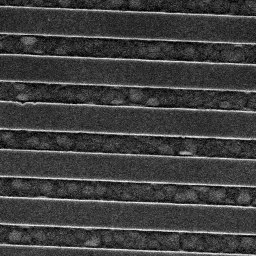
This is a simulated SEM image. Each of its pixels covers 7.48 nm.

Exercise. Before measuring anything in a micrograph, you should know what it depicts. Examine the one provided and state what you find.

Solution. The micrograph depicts parallel lines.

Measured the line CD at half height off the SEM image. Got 204 nm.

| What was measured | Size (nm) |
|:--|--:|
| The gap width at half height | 153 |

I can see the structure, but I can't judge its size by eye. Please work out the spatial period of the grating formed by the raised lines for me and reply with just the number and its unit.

357 nm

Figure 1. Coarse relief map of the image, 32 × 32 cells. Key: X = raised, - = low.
--------------------------------
XXXXXXXXXXXXXXXXX---------------
XXXXXXXXXXXXXXXXXXXXXXXXXXXXXXXX
XXXXXXXXXXXXXXXXXXXXXXXXXXXXXXXX
---------XXXXXXXXXXXXXXXXXXXXXXX
--------------------------------
--------------------------------
XXXXXXXXXXXXXXXXXX--------------
XXXXXXXXXXXXXXXXXXXXXXXXXXXXXXXX
XXXXXXXXXXXXXXXXXXXXXXXXXXXXXXXX
----------XXXXXXXXXXXXXXXXXXXXXX
--------------------------------
--------------------------------
XXXXXXXXXXXXXXXXXXX-------------
XXXXXXXXXXXXXXXXXXXXXXXXXXXXXXXX
XXXXXXXXXXXXXXXXXXXXXXXXXXXXXXXX
-----------XXXXXXXXXXXXXXXXXXXXX
--------------------------------
--------------------------------
XXXXXXXXXXXXXXXXXXXX------------
XXXXXXXXXXXXXXXXXXXXXXXXXXXXXXXX
XXXXXXXXXXXXXXXXXXXXXXXXXXXXXXXX
------------XXXXXXXXXXXXXXXXXXXX
--------------------------------
--------------------------------
XXXXXXXXXXXXXXXXXXXXX-----------
XXXXXXXXXXXXXXXXXXXXXXXXXXXXXXXX
XXXXXXXXXXXXXXXXXXXXXXXXXXXXXXXX
-------------XXXXXXXXXXXXXXXXXXX
--------------------------------
--------------------------------
XXXXXXXXXXXXXXXXXXXXXX----------